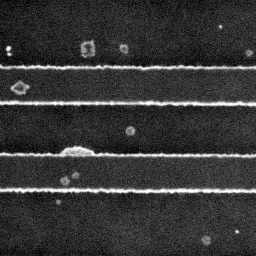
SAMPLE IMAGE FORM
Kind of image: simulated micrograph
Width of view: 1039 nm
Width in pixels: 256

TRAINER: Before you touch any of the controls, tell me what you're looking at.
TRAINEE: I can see lines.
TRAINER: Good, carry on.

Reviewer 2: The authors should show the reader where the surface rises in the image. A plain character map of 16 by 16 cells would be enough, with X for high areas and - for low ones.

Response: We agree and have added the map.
----------------
----------------
----------------
----------------
XXXXXXXXXXXXXXXX
XXXXXXXXXXXXXXXX
----------XXXXXX
----------------
----------------
----X-----------
XXXXXXXXXXXXXXXX
XXXXXXXXXXXXXXXX
----------------
----------------
----------------
----------------